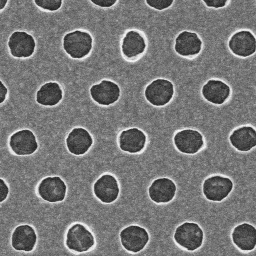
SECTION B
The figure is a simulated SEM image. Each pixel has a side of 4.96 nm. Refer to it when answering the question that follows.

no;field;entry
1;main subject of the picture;a regular array of holes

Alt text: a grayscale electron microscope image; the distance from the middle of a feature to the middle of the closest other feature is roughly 270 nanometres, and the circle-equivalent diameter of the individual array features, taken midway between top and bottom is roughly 26.8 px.